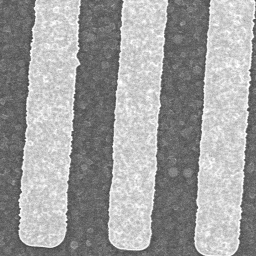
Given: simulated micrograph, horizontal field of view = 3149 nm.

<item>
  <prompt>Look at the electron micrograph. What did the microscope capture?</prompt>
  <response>one or a few lines or trenches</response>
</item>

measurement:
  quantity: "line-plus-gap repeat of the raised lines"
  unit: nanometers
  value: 1070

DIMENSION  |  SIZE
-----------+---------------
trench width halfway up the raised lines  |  541 nm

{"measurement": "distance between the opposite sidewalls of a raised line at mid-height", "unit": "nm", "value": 526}